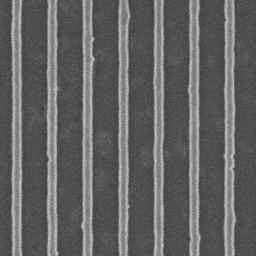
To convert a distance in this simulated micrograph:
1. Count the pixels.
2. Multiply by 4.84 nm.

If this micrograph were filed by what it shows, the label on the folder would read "parallel lines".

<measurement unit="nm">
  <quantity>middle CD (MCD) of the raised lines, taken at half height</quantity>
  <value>38.1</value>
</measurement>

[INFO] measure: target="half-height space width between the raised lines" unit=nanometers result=137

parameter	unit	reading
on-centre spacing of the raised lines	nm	171